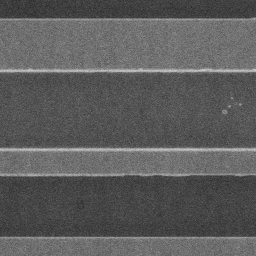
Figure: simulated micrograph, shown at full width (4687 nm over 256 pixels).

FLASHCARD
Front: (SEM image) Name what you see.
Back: lines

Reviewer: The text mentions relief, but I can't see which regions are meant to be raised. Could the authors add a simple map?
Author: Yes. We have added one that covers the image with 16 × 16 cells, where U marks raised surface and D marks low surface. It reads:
DDDDDDDDDDDDDDDD
UUUUUUUUUUUUUUUU
UUUUUUUUUUUUUUUU
UUUUUUUUUUUUUUUU
DDDDDDDDDDDDDDDD
DDDDDDDDDDDDDDDD
DDDDDDDDDDDDDDDD
DDDDDDDDDDDDDDDD
DDDDDDDDDDDDDDDD
UUUUUUUUUUUUUUUU
UUUUUUUUUUUUUUUU
DDDDDDDDDDDDDDDD
DDDDDDDDDDDDDDDD
DDDDDDDDDDDDDDDD
DDDDDDDDDDDDDDDD
UUUUUUUUUUUUUUUU